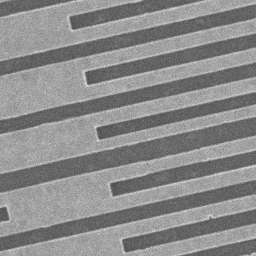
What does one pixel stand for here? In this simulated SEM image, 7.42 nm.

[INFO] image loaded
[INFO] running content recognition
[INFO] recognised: parallel lines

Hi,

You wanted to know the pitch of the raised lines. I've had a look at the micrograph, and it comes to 0.212 micrometres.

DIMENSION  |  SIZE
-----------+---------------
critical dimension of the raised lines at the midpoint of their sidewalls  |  103 nm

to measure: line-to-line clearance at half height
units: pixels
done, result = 14.9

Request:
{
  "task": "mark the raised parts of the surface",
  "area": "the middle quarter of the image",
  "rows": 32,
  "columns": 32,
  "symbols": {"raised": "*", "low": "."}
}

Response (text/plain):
***********.................****
******..................********
*****..............*************
*****..........***************..
*****.....****************......
*********************...........
*****************...............
*************.................**
********.................*******
****................************
................***************.
...........****************.....
.......***************..........
...***************..............
*************................***
*********...............********
********.............***********
********........************....
********....***********.........
*******************.............
**************..................
**********......................
******.......................***
*.......................********
...................*************
...............**************...
..........***************.......
......***************...........
.****************...............
************..................**
***********..............*******
************.........***********